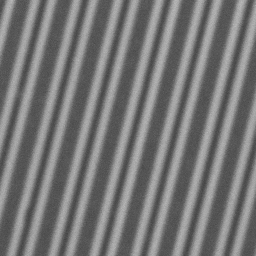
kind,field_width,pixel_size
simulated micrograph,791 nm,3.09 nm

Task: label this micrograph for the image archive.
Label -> parallel lines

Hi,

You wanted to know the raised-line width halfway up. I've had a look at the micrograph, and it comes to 0.0214 um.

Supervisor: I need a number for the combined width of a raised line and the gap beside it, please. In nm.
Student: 61.7